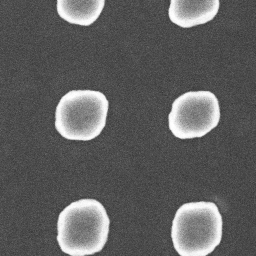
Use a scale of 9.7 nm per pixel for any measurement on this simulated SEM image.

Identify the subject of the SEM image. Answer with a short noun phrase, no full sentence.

raised bodies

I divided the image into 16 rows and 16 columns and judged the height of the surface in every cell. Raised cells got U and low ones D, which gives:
DDDDUUDDDDDUUUDD
DDDDDDDDDDDDDDDD
DDDDDDDDDDDDDDDD
DDDDDDDDDDDDDDDD
DDDDDDDDDDDDDDDD
DDDDDDDDDDDDDDDD
DDDDUUUDDDDUUUDD
DDDDUUUDDDDUUDDD
DDDDUUDDDDDDDDDD
DDDDDDDDDDDDDDDD
DDDDDDDDDDDDDDDD
DDDDDDDDDDDDDDDD
DDDDDDDDDDDDDDDD
DDDDUUUDDDDUUUDD
DDDDUUUDDDDUUUDD
DDDDUUDDDDDUUDDD